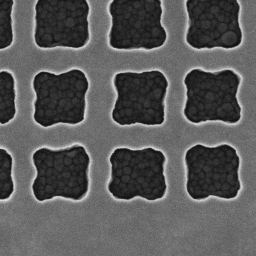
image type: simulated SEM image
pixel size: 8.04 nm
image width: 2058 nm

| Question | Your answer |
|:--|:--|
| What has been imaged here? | holes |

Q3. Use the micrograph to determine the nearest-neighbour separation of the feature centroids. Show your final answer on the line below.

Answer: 0.604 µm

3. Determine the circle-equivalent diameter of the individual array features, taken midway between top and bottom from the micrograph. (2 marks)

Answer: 57.5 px